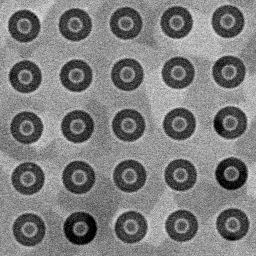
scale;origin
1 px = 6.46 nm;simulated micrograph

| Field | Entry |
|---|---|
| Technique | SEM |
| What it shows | an array of small figures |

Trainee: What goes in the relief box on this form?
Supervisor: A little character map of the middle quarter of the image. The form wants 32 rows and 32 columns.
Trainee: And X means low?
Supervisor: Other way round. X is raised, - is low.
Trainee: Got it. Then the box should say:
------XXXXXX--------XXXXX-------
--XX---XXXXX--XXX---XXXX---XXX--
-XXXX--XXXXX--XXXX--XXXX---XXX--
-XXXX--XXXXX--XXX---XXXX----XX--
--XX---XXXXX--------XXXXX-------
------XXXXXXX------XXXXXXX-----X
X----XXXXXXXXX----XXXXXXXXXXXXXX
XXXXXXXXXXXXXXXXXXXXXXXXXXXXXXXX
XXXXXXXXXXXXXXXXXXXXXXXXXXXXXXXX
XXXXXXXXXXXXXXXXXXXXXXXXXXXXXXXX
XXXXXXXXXXXXXXXXXXXXXXXXXXXXXXXX
XXX-XXXXXXXXXX----XXXXXXXXX----X
X-----XXXXXXX------XXXXXXX------
-------XXXXX--------XXXXX---XX--
--XXX--XXXXX---XXX--XXXXX--XXX--
--XXX---XXXX--XXXX---XXXX--XXX--
--XXX--XXXXX---XXX--XXXXX---XX--
-------XXXXX--------XXXXX-------
-------XXXXXX------XXXXXXX-----X
XX---XXXXXXXXXX--XXXXXXXXXXXXXXX
XXXXXXXXXXXXXXXXXXXXXXXXXXXXXXXX
XXXXXXXXXXXXXXXXXXXXXXXXXXXXXXXX
XXXXXXXXXXXXXXXXXXXXXXXXXXXXXXXX
XXXXXXXXXXXXXXXXXXXXXXXXXXXXXXXX
XX---XXXXXXXXX-----XXXXXXXX-----
-------XXXXXX-------XXXXXX------
-------XXXXX----X---XXXXX---XX--
--XXX---XXXX---XXX---XXXX--XXXX-
--XXX---XXXX---XXX---XXXX---XXX-
--XXX---XXXX---XX---XXXXX-------
-------XXXXXX-------XXXXXX------
X-----XXXXXXXX-----XXXXXXXX----X